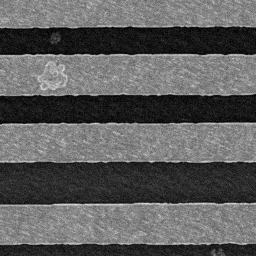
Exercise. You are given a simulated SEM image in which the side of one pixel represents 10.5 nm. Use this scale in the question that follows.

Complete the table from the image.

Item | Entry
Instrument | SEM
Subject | lines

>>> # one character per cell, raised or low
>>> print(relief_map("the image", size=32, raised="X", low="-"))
XXXXXXXXXXXXXXXXXXXXXXXXXXXXXXXX
XXXXXXXXXXXXXXXXXXXXXXXXXXXXXXXX
XXXXXXXXXXXXXXXXXXXXXXXXXXXXXXXX
--------------------------------
--------------------------------
--------------------------------
--------------------------------
XXXXXXXXXXXXXXXXXXXXXXXXXXXXXXXX
XXXXXXXXXXXXXXXXXXXXXXXXXXXXXXXX
XXXXXXXXXXXXXXXXXXXXXXXXXXXXXXXX
XXXXXXXXXXXXXXXXXXXXXXXXXXXXXXXX
XXXXXXXXXXXXXXXXXXXXXXXXXXXXXXXX
--------------------------------
--------------------------------
--------------------------------
-----X-X---XXXXX-----XXXXXXXXXXX
XXXXXXXXXXXXXXXXXXXXXXXXXXXXXXXX
XXXXXXXXXXXXXXXXXXXXXXXXXXXXXXXX
XXXXXXXXXXXXXXXXXXXXXXXXXXXXXXXX
XXXXXXXXXXXXXXXXXXXXXXXXXXXXXXXX
--------------------------------
--------------------------------
--------------------------------
--------------------------------
--------------------------------
----------------XXXX---XXXX-XXXX
XXXXXXXXXXXXXXXXXXXXXXXXXXXXXXXX
XXXXXXXXXXXXXXXXXXXXXXXXXXXXXXXX
XXXXXXXXXXXXXXXXXXXXXXXXXXXXXXXX
XXXXXXXXXXXXXXXXXXXXXXXXXXXXXXXX
XXXXXXXXXXX-XX-XX-XXXXXXXXX--XX-
--------------------------------